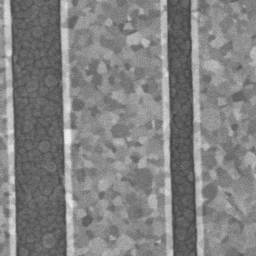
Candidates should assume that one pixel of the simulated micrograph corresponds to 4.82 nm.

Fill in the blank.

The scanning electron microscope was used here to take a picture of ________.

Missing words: one or a few lines or trenches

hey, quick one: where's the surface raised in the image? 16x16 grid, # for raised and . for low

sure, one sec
....######..####
....######..####
....######..####
#...######..####
#...######..####
#...######..####
#...######..####
#...######..####
#...######..####
#...######..####
#...######..####
#...######..####
#...######..####
#...#######.####
#...#######..###
#...#######..###